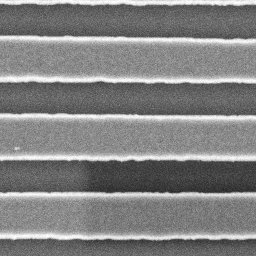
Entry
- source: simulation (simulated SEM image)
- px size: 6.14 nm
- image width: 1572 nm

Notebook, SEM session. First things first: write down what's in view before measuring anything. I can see lines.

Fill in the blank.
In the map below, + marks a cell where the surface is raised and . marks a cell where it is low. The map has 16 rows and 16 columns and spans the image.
................
................
++++++++++++++..
++++++++++++++++
++++++++++++++++
................
................
++++++++++++++++
++++++++++++++++
++++++++++++++++
................
................
++++++++++++++++
++++++++++++++++
++++++++++++++++
................